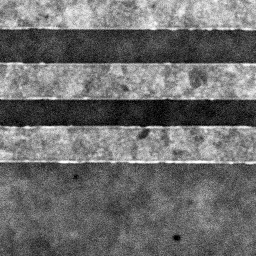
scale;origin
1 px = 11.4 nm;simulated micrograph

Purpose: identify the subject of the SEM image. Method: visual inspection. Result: lines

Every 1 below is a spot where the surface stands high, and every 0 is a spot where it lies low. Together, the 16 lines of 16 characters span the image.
1111111111111111
1111111111111111
0000000000000000
0000000000000000
1111111111111111
1111111111111111
0000000000000000
0000000000000000
1111111111111111
1111111111111111
0000000000000000
0000000000000000
0000000000000000
0000000000000000
0000000000000000
0000000000000000